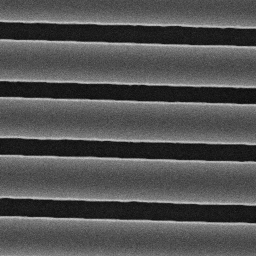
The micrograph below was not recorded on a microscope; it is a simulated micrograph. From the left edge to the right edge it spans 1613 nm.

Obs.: lines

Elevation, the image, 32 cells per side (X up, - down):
XXXXXXXXXXXXXXXXXXXXXXXXXXXXXXXX
XXXXXXXXXXXXXXXXXXXXXXXXXXXXXXXX
XXXXXXXXXXXXXXXXXXXXXXXXXXXXXXXX
-----------------------------XXX
--------------------------------
XXXXXXXXXXXXXXXXX---------------
XXXXXXXXXXXXXXXXXXXXXXXXXXXXXXXX
XXXXXXXXXXXXXXXXXXXXXXXXXXXXXXXX
XXXXXXXXXXXXXXXXXXXXXXXXXXXXXXXX
XXXXXXXXXXXXXXXXXXXXXXXXXXXXXXXX
--------------XXXXXXXXXXXXXXXXXX
--------------------------------
XXXXXXXXXX----------------------
XXXXXXXXXXXXXXXXXXXXXXXXXXXXXXXX
XXXXXXXXXXXXXXXXXXXXXXXXXXXXXXXX
XXXXXXXXXXXXXXXXXXXXXXXXXXXXXXXX
XXXXXXXXXXXXXXXXXXXXXXXXXXXXXXXX
-----------XXXXXXXXXXXXXXXXXXXXX
--------------------------------
XXX-----------------------------
XXXXXXXXXXXXXXXXXXXXXXXXXXXXXXXX
XXXXXXXXXXXXXXXXXXXXXXXXXXXXXXXX
XXXXXXXXXXXXXXXXXXXXXXXXXXXXXXXX
XXXXXXXXXXXXXXXXXXXXXXXXXXXXXXXX
XXXXXXXXXXXXXXXXXXXXXXXXXXXXXXXX
------------------------XXXXXXXX
--------------------------------
XXXXXXXXXXXXXX------------------
XXXXXXXXXXXXXXXXXXXXXXXXXXXXXXXX
XXXXXXXXXXXXXXXXXXXXXXXXXXXXXXXX
XXXXXXXXXXXXXXXXXXXXXXXXXXXXXXXX
XXXXXXXXXXXXXXXXXXXXXXXXXXXXXXXX